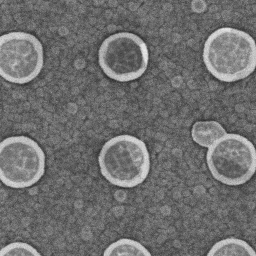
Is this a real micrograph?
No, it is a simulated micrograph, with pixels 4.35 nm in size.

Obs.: raised bodies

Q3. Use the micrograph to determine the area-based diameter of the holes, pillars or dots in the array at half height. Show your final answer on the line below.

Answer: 200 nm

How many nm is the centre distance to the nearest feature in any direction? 454